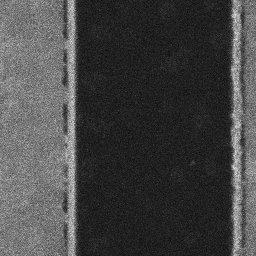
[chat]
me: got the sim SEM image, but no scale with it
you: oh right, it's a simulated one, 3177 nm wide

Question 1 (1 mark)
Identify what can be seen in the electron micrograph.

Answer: one or a few lines or trenches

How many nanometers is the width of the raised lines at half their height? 2070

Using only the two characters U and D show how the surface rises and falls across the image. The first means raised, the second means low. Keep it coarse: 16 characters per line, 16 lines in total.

DDDDUUUUUUUUUUUD
DDDDUUUUUUUUUUUD
DDDDUUUUUUUUUUUD
DDDDUUUUUUUUUUUD
DDDDUUUUUUUUUUUD
DDDDUUUUUUUUUUUD
DDDDUUUUUUUUUUUD
DDDDUUUUUUUUUUUD
DDDDUUUUUUUUUUUD
DDDDUUUUUUUUUUUD
DDDDUUUUUUUUUUUD
DDDDDUUUUUUUUUUD
DDDDUUUUUUUUUUUD
DDDDUUUUUUUUUUUD
DDDDUUUUUUUUUUUD
DDDDUUUUUUUUUUUD